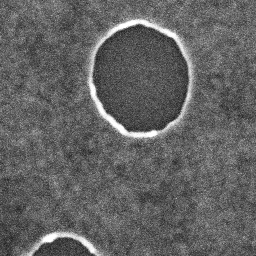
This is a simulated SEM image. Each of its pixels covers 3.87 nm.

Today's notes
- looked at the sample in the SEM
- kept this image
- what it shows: holes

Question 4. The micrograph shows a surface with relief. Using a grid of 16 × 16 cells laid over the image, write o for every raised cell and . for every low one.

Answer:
oooooooooooooooo
oooooooooooooooo
ooooooo....ooooo
oooooo.....ooooo
oooooo......oooo
oooooo......oooo
oooooo......oooo
ooooooo....ooooo
oooooooooooooooo
oooooooooooooooo
oooooooooooooooo
oooooooooooooooo
oooooooooooooooo
oooooooooooooooo
oooooooooooooooo
oo...ooooooooooo